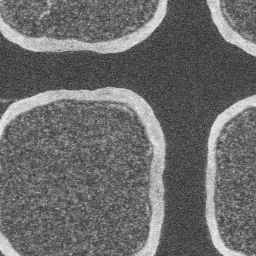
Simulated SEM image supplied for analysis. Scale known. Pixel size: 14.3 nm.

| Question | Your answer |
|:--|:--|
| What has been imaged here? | raised bodies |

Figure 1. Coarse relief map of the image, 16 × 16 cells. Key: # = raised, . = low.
##########...###
##########....##
.#######.......#
................
................
................
..#######......#
#########.....##
##########...###
##########...###
##########...###
##########...###
##########...###
##########...###
##########...###
#########.....##